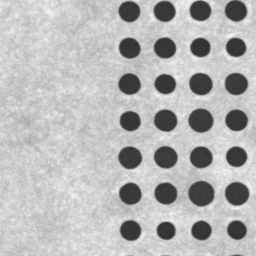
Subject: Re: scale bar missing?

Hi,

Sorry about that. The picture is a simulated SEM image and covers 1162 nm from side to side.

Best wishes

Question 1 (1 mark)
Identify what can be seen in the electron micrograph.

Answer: a regular array of holes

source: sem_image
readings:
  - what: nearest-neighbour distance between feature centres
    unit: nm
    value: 161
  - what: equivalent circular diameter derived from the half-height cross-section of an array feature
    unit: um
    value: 0.0991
